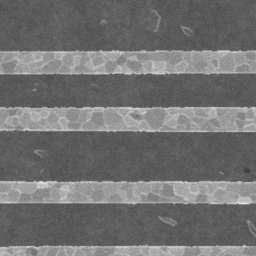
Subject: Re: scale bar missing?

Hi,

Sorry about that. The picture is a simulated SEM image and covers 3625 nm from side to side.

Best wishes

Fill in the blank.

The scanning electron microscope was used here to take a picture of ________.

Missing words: lines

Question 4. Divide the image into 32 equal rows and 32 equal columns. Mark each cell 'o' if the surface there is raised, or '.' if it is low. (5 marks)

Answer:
................................
................................
...................o............
...................o............
................................
................................
oooooooooooooooooooooooooooooooo
oooooooooooooooooooooooooooooooo
oooooooooooooooooooooooooooooooo
................................
................................
................................
................................
oooo.ooooooooooooooooooooooooooo
oooooooooooooooooooooooooooooooo
oooooooooooooooooooooooooooooooo
................................
................................
................................
................................
................................
................................
................................
oooooooooooooooooooooooooooooooo
oooooooooooooooooooooooooooooooo
................................
................................
................................
...............................o
................................
................................
oooooooooooooooooooooooooooooooo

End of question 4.